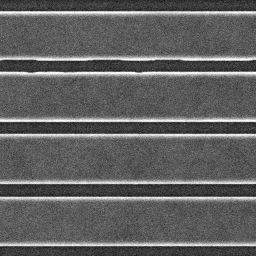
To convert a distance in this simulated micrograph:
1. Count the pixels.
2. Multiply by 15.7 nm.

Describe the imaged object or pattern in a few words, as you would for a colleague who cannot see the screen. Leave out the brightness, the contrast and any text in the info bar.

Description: lines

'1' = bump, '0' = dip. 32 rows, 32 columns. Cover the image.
00000000000000000000000000000000
00000000000000000000000000000000
11111111111111111111111111111111
11111111111111111111111111111111
11111111111111111111111111111111
11111111111111111111111111111111
11111111111111111111111111111111
00000000000000000000000000000000
00000000000000000000000000000000
11111111111111111111111111111111
11111111111111111111111111111111
11111111111111111111111111111111
11111111111111111111111111111111
11111111111111111111111111111111
11111111111111111111111111111111
00000000000000000000000000000000
00000000000000000000000000000000
11111111111111111111111111111111
11111111111111111111111111111111
11111111111111111111111111111111
11111111111111111111111111111111
11111111111111111111111111111111
11111111111111111111111111111111
00000000000000000000000000000000
00000000000000000000000000000000
11111111111111111111111111111111
11111111111111111111111111111111
11111111111111111111111111111111
11111111111111111111111111111111
11111111111111111111111111111111
11111111111111111111111111111111
00000000000000000000000000000000